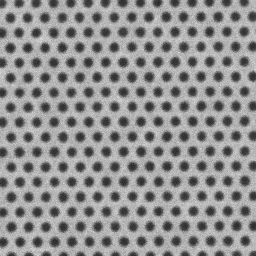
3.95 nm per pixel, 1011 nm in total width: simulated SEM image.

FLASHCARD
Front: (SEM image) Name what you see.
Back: a regular array of holes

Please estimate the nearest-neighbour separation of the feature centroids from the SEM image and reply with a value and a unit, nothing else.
67.3 nm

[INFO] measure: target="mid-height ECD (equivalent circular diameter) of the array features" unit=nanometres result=43.4